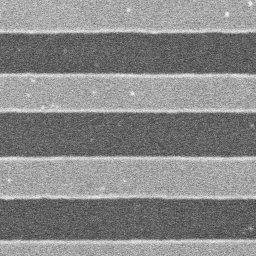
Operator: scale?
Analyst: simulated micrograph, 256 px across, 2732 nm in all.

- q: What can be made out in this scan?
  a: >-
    lines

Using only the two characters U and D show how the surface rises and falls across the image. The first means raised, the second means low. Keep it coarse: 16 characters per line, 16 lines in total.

UUUUUUUUUUUUUUUU
UUUUUUUUUUUUUUUU
DDDDDDDDDDDDDDDD
DDDDDDDDDDDDDDDD
DDDDDDDDDDDDDDDD
UUUUUUUUUUUUUUUU
UUUUUUUUUUUUUUUU
DDDDDDDDDDDDDDDD
DDDDDDDDDDDDDDDD
DDDDDDDDDDDDDDDD
UUUUUUUUUUUUUUUU
UUUUUUUUUUUUUUUU
DDDDDDDDDDDDDDDD
DDDDDDDDDDDDDDDD
DDDDDDDDDDDDDDDD
UUUUUUUUUUUUUUUU